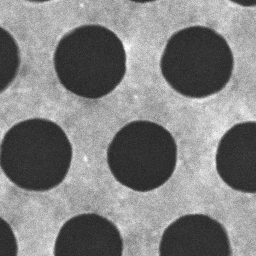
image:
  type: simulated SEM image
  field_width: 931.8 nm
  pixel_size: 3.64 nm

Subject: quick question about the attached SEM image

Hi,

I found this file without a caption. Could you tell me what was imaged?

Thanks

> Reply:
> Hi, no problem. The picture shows holes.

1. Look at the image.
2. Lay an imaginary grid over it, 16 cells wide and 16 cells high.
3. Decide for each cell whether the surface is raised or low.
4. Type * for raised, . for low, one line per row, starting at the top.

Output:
****************
****************
.***...****...**
.**.....**.....*
.**.....**.....*
****...****...**
****************
**.*************
....***....***..
....***....***..
....***....***..
*...****..****..
****************
*****.*****..***
.***...***....**
.**.....**....**